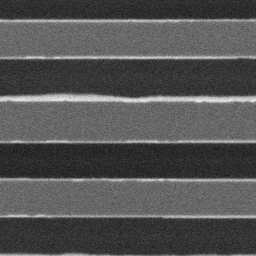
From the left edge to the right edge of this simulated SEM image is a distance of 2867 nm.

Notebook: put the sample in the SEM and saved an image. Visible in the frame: lines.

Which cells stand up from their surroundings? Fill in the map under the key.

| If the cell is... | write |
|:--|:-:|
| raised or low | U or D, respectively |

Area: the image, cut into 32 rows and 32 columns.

DDDDDDDDDDDDDDDDDDDDDDDDDDDDDDDD
DDDDDDDDDDDDDDDDDDDDDDDDDDDDDDDD
DDDDDDDDDDDDDDDDDDDDDDDDDDDDDDDD
UUUUUUUUUUUUUUUUUUUUUUUUUUUUUUUU
UUUUUUUUUUUUUUUUUUUUUUUUUUUUUUUU
UUUUUUUUUUUUUUUUUUUUUUUUUUUUUUUU
UUUUUUUUUUUUUUUUUUUUUUUUUUUUUUUU
DDDDDDDDDDDDDDDDDDDDDDDDDDDDDDDD
DDDDDDDDDDDDDDDDDDDDDDDDDDDDDDDD
DDDDDDDDDDDDDDDDDDDDDDDDDDDDDDDD
DDDDDDDDDDDDDDDDDDDDDDDDDDDDDDDD
DDDDDDDDDDDDDDDDDDDDDDDDDDDDDDDD
UUUUUUUUUUUUUUUDDDDDDDDDDDDDDDDD
UUUUUUUUUUUUUUUUUUUUUUUUUUUUUUUU
UUUUUUUUUUUUUUUUUUUUUUUUUUUUUUUU
UUUUUUUUUUUUUUUUUUUUUUUUUUUUUUUU
UUUUUUUUUUUUUUUUUUUUUUUUUUUUUUUU
UUUUUUUUUUUUUUUUUUUUUUUUUUUUUUUU
DDDDDDDDDDDDDDDDDDDDDDDDDDDDDDDD
DDDDDDDDDDDDDDDDDDDDDDDDDDDDDDDD
DDDDDDDDDDDDDDDDDDDDDDDDDDDDDDDD
DDDDDDDDDDDDDDDDDDDDDDDDDDDDDDDD
UUUUUUUUUUUUUUDUUUUUUUDDDDDDDDDD
UUUUUUUUUUUUUUUUUUUUUUUUUUUUUUUU
UUUUUUUUUUUUUUUUUUUUUUUUUUUUUUUU
UUUUUUUUUUUUUUUUUUUUUUUUUUUUUUUU
UUUUUUUUUUUUUUUUUUUUUUUUUUUUUUUU
DDDDDDDDDDDDDDDDDDDDDDDDDDDDDDDD
DDDDDDDDDDDDDDDDDDDDDDDDDDDDDDDD
DDDDDDDDDDDDDDDDDDDDDDDDDDDDDDDD
DDDDDDDDDDDDDDDDDDDDDDDDDDDDDDDD
DDDDDDDDDDDDDDDDDDDDDDDDDDDDDDDD